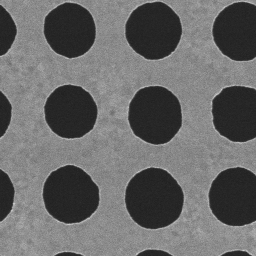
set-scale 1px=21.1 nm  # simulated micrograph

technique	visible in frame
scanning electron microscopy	holes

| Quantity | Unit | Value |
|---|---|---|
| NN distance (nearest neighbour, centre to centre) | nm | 1760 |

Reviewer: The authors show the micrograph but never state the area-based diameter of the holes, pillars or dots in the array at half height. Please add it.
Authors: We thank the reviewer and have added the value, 1210 nanometres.